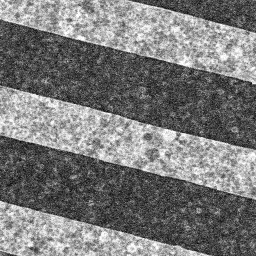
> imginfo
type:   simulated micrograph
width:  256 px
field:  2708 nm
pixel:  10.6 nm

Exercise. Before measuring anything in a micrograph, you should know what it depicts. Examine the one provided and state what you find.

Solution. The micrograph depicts one or a few lines or trenches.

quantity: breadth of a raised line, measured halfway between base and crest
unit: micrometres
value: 0.498